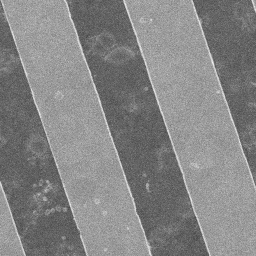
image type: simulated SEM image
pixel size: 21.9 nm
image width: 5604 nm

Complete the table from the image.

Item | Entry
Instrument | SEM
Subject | one or a few lines or trenches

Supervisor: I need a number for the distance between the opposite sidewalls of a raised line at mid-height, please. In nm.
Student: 1330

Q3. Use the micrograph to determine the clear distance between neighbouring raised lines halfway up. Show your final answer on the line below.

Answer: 1220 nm